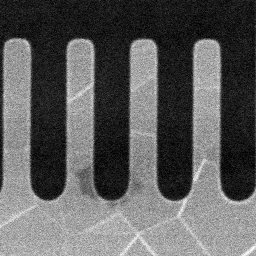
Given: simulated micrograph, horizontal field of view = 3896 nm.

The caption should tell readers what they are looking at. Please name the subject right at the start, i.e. groups of lines, slits or small figures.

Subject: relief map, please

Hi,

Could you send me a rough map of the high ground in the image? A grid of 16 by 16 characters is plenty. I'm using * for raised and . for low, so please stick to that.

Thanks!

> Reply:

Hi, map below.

................
................
................
**..**..**..**..
**..**..**..**..
**..**..**..**..
**..**..**..**..
**..**..**..**..
**..**..**..**..
**..**..**..**..
**..**..**..**..
**..**..**..**..
**************.*
****************
****************
****************